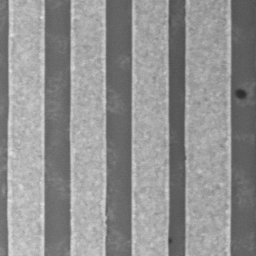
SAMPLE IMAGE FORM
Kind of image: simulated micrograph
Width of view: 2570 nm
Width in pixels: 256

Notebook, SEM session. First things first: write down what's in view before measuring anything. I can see one or a few lines or trenches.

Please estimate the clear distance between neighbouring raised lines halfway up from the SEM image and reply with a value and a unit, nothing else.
284 nm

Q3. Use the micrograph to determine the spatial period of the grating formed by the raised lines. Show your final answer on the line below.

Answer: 608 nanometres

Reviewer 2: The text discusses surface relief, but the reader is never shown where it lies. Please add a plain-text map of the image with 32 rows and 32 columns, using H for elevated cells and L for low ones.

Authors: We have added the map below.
LHHHHLLLLHHHHLLLLHHHHLLHHHHHHLLL
LHHHHLLLLHHHHLLLLHHHHLLHHHHHHLLL
LHHHHLLLLHHHHLLLLHHHHLLHHHHHHLLL
LHHHHLLLLHHHHLLLLHHHHLLHHHHHHLLL
LHHHHLLLLHHHHLLLLHHHHLLHHHHHHLLL
LHHHHLLLLHHHHLLLLHHHHLLHHHHHHLLL
LHHHHLLLLHHHHLLLLHHHHLLHHHHHHLLL
LHHHHLLLLHHHHLLLLHHHHLLHHHHHHLLL
LHHHHLLLLHHHHLLLLHHHHLLHHHHHHLLL
LHHHHLLLLHHHHLLLLHHHHLLHHHHHHLLL
LHHHHLLLLHHHHLLLLHHHHLLHHHHHHLLL
LHHHHLLLLHHHHLLLLHHHHLLHHHHHHLLL
LHHHHLLLLHHHHLLLLHHHHLLHHHHHHLLL
LHHHHLLLLHHHHLLLLHHHHLLHHHHHHLLL
LHHHHLLLLHHHHLLLLHHHHLLHHHHHHLLL
LHHHHLLLLHHHHLLLLHHHHLLHHHHHHLLL
LHHHHLLLLHHHHLLLLHHHHLLHHHHHHLLL
LHHHHLLLLHHHHLLLLHHHHLLHHHHHHLLL
LHHHHLLLLHHHHLLLLHHHHLLHHHHHHLLL
LHHHHLLLLHHHHLLLLHHHHLLHHHHHHLLL
LHHHHLLLLHHHHLLLLHHHHLLHHHHHHLLL
LHHHHLLLLHHHHLLLLHHHHLLHHHHHHLLL
LHHHHLLLLHHHHLLLLHHHHLLHHHHHHLLL
LHHHHLLLLHHHHLLLLHHHHLLHHHHHHLLL
LHHHHLLLLHHHHLLLLHHHHLLHHHHHHLLL
LHHHHLLLLHHHHLLLLHHHHLLHHHHHHLLL
LHHHHLLLLHHHHLLLLHHHHLLHHHHHHLLL
LHHHHLLLLHHHHLLLLHHHHLLHHHHHHLLL
LHHHHLLLLHHHHLLLLHHHHLLHHHHHHLLL
LHHHHLLLLHHHHLLLLHHHHLLHHHHHHLLL
LHHHHLLLLHHHHLLLLHHHHLLHHHHHHLLL
LHHHHLLLLHHHHLLLLHHHHLLHHHHHHLLL